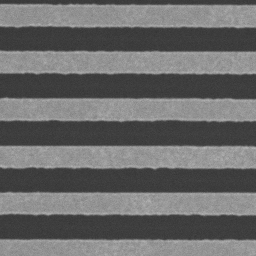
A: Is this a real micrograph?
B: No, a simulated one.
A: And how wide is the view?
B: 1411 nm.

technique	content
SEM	lines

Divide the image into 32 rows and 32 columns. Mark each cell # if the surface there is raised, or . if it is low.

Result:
................................
################################
################################
................................
................................
................................
###########.#......#............
################################
################################
................................
................................
................................
################################
################################
################################
................................
................................
................................
################################
################################
################################
................................
................................
................................
################################
################################
################################
................................
................................
................................
################################
################################